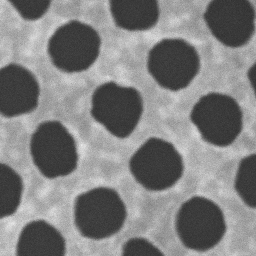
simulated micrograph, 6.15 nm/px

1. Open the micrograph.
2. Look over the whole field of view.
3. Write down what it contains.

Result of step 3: a regular array of holes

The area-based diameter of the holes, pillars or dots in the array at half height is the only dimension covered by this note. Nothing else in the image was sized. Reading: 0.324 µm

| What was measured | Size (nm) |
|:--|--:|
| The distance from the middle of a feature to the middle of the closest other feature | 444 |